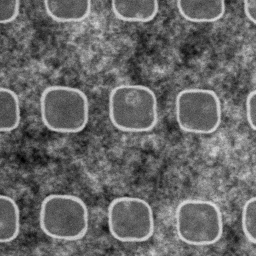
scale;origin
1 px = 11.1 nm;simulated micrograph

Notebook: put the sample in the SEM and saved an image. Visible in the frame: raised bodies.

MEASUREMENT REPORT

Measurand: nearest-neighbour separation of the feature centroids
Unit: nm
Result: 739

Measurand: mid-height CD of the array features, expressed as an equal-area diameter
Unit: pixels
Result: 45.3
